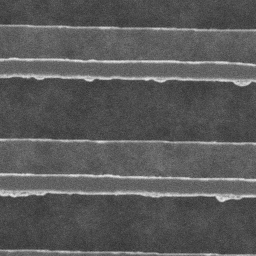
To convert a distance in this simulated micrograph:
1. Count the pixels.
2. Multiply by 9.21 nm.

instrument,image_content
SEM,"lines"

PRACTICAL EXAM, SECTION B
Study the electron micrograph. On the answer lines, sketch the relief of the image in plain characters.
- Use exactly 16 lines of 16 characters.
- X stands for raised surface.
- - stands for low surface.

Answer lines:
----------------
----------------
XXXXXXXXXXXXXXXX
XXXXXXXXXXXXXXXX
XXXXXXXXXXXXXXXX
----------------
----------------
----------------
----------------
XXXXXXXXXXXXXXXX
XXXXXXXXXXXXXXXX
XXXXXXXXXXXXXXXX
----------------
----------------
----------------
----------------